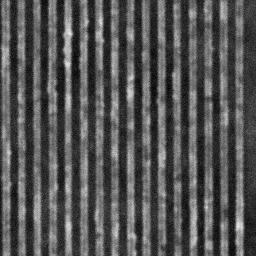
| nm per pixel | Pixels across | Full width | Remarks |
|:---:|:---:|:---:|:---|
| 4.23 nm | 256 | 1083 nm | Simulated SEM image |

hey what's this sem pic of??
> parallel lines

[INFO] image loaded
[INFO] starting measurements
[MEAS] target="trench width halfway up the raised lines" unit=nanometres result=42.8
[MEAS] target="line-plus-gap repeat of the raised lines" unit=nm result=65.8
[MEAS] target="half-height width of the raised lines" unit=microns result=0.0249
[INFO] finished